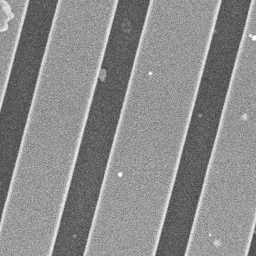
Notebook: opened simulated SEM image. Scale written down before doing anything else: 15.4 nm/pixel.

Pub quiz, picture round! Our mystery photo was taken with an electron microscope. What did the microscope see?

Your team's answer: lines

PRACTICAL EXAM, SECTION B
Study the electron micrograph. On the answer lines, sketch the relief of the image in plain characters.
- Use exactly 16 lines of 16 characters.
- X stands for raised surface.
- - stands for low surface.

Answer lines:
XX--XXX--XXXXX--
X--XXXX--XXXX--X
X--XXXX--XXXX--X
X--XXX--XXXXX--X
X-XXXX--XXXXX--X
--XXXX--XXXX--XX
--XXXX--XXXX--XX
--XXX--XXXXX--XX
-XXXX--XXXXX--XX
-XXXX--XXXX--XXX
-XXXX--XXXX--XXX
-XXX--XXXXX--XXX
XXXX--XXXXX-XXXX
XXXX--XXXX--XXXX
XXXX--XXXX--XXXX
XXX--XXXXX--XXXX